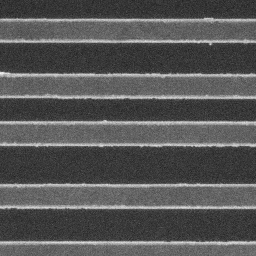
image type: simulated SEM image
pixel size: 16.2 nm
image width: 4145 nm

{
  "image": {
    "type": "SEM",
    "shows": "lines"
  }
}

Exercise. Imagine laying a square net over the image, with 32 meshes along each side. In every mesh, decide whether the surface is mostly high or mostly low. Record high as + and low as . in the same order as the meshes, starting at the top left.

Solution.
................................
................................
+++++++++++++...++..............
++++++++++++++++++++++++++++++++
++++++++++++++++++++++++++++++++
................................
................................
................................
................................
++++++++++++++++++++++++++++++++
++++++++++++++++++++++++++++++++
++++++++++++++++++++++++++++++++
................................
................................
................................
++++++++++++++++++++++++++++++++
++++++++++++++++++++++++++++++++
++++++++++++++++++++++++++++++++
................................
................................
................................
................................
................................
++++++++++++++++++++++++++++++++
++++++++++++++++++++++++++++++++
++++++++++++++++++++++++++++++++
................................
................................
................................
................................
++++++++++++++++++++++++++++++++
++++++++++++++++++++++++++++++++